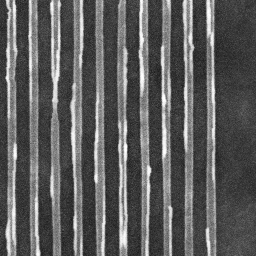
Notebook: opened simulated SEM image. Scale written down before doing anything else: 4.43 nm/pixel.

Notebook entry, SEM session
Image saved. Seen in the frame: parallel lines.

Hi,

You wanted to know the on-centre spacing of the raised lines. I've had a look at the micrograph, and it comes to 98.1 nanometres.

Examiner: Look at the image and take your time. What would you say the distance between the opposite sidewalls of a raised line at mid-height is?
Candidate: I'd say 34.3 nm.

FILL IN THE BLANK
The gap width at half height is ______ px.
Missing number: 14.4